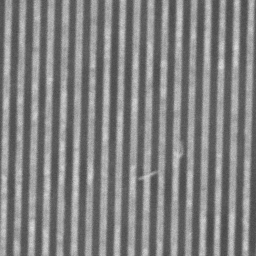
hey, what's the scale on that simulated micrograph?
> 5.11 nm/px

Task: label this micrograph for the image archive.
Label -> parallel lines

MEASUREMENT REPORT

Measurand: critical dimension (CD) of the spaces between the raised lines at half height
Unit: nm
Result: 50.5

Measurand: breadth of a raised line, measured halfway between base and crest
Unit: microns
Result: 0.0249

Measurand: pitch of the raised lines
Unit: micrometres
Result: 0.073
